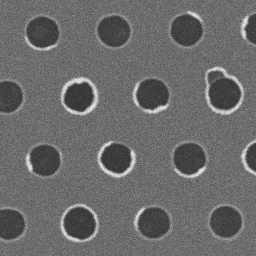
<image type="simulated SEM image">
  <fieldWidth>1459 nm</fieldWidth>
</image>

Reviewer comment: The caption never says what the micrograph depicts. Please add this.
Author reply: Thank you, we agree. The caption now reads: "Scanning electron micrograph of a regular array of holes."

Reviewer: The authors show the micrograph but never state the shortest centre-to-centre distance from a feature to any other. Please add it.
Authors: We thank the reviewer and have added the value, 0.411 microns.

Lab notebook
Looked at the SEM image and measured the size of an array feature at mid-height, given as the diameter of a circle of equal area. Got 184 nanometres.